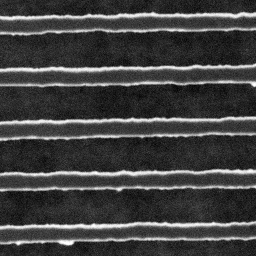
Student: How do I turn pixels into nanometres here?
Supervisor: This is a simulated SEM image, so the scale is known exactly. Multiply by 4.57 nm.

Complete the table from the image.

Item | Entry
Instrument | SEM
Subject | lines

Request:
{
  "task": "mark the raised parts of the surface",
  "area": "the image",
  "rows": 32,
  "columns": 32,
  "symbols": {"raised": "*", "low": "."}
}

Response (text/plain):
................................
................................
********************************
********************************
................................
................................
................................
................................
..............******************
********************************
******************....**........
................................
................................
................................
................................
********************************
********************************
................................
................................
................................
................................
...............*..**.***********
********************************
****************..*.**..........
................................
................................
................................
................................
********************************
********************************
................................
................................